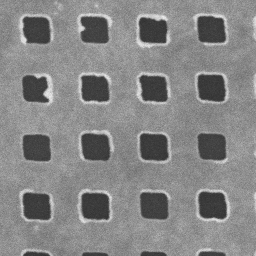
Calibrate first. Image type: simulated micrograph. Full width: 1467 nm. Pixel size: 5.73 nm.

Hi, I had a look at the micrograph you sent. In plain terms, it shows a regular array of holes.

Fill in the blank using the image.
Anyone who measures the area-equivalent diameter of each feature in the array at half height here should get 169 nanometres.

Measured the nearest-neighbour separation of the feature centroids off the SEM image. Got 0.334 µm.